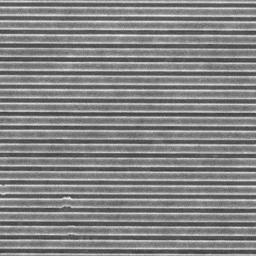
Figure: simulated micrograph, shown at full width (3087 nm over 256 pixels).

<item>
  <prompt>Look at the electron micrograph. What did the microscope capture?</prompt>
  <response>parallel lines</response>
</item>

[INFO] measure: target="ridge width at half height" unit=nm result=102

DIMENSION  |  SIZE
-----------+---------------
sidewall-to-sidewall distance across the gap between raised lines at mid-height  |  61.8 nm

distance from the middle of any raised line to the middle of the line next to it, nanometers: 165